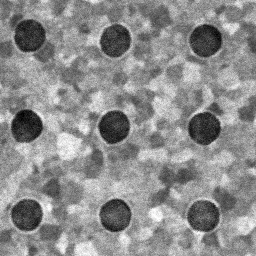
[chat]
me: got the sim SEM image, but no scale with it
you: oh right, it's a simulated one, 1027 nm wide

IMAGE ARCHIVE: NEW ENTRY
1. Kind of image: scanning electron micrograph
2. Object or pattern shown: a regular array of holes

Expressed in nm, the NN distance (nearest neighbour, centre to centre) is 351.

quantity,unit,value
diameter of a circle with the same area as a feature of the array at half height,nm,138